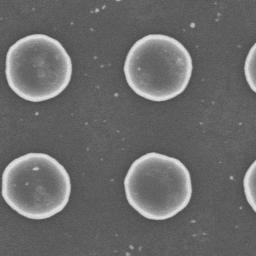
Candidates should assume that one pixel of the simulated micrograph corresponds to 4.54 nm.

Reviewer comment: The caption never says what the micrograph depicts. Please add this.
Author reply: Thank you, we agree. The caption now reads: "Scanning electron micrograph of raised bodies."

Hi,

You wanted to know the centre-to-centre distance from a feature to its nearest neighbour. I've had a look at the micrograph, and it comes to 537 nm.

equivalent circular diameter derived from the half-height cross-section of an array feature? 290 nm